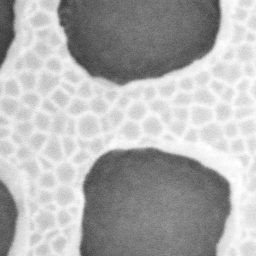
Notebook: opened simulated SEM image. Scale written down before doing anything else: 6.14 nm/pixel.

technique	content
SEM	holes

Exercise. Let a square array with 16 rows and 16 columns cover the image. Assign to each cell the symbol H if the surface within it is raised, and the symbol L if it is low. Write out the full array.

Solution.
LLHHLLLLLLLLLLHH
LHHHLLLLLLLLLLHH
LHHHLLLLLLLLLLHH
LHHHLLLLLLLLLHHH
HHHHHLLLLLLHHHHH
HHHHHHHHHHHHHHHH
HHHHHHHHHHHHHHHH
HHHHHHHHHHHHHHHH
HHHHHHHHHHHHHHHH
HHHHHHHLLLLHHHHH
LHHHHHLLLLLLLHHH
LHHHHLLLLLLLLLHH
LHHHHLLLLLLLLLLH
LLHHHLLLLLLLLLLH
LHHHHLLLLLLLLLLH
LHHHHLLLLLLLLLHH